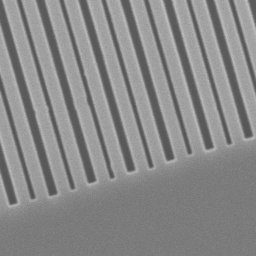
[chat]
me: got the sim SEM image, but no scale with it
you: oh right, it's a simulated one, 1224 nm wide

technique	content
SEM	parallel lines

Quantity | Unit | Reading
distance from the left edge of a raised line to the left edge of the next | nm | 96.8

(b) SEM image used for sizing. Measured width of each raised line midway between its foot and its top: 13.6 pixels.